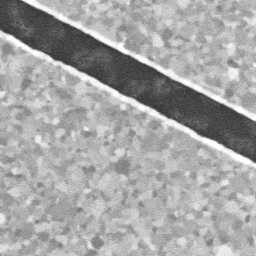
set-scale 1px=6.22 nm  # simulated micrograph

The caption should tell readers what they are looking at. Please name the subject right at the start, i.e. one or a few lines or trenches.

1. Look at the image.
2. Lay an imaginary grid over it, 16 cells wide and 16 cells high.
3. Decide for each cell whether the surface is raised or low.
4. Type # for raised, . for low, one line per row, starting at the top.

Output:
...#############
.....###########
#......#########
###.....########
#####.....######
#######.....####
#########.....##
##########......
############....
##############..
################
################
################
################
################
################